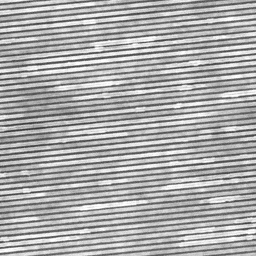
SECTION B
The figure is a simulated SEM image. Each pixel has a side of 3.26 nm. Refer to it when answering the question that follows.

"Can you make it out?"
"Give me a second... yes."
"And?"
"parallel lines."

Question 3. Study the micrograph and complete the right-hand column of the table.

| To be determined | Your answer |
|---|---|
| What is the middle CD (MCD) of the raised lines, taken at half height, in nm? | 9.7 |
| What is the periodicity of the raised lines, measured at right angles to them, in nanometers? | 18.8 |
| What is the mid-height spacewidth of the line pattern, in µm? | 0.0097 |